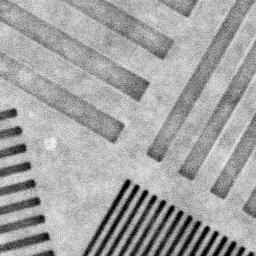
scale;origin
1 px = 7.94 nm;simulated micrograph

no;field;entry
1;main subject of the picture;groups of lines, slits or small figures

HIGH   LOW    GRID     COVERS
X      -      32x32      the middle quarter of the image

XXX------------XXXXXXXXXXXXXXXXX
XXXXX------------XXXXXXXXXXXXXXX
XXXXXX------------XXXXXXXXXXXXXX
XXXXXXXX------------XXXXXXXXXXX-
XXXXXXXXXX-----------XXXXXXXXXX-
XXXXXXXXXXX----------XXXXXXXXX--
-XXXXXXXXXXXX--------XXXXXXXXX--
---XXXXXXXXXXXX-----XXXXXXXXX---
----XXXXXXXXXXXX---XXXXXXXXX----
------XXXXXXXXXXXXXXXXXXXXXX----
--------XXXXXXXXXXXXXXXXXXX-----
----------XXXXXXXXXXXXXXXXX-----
-----------XXXXXXXXXXXXXXX-----X
X------------XXXXXXXXXXXX------X
XXX------------XXXXXXXXXX-----XX
XXXXX----------XXXXXXXXX------XX
XXXXXX---------XXXXXXXXX-----XXX
XXXXXXXX------XXXXXXXXX-----XXXX
XXXXXXXXXX----XXXXXXXX------XXXX
XXXXXXXXXXX--XXXXXXXXX-----XXXXX
XXXXXXXXXXXXXXXXXXXXX------XXXXX
XXXXXXXXXXXXXXXXXXXXX-----XXXXX-
XXXXXXXXXXXXXXXXXXXXX----XXXXXX-
XXXXXXXXXXXXXXXXXXXXXX---XXXXX--
XXXXXXXXXXXXXXXXXXXXXXX-XXXXXX--
XXXXXXXXXXXXXXXXXXXXXXXXXXXXX---
XXXXXXXXXXXXXXXXXXXXXXXXXXXXX---
XXXXXXXXXXXXXXXXXXXXXXXXXXXXX---
XXXXXXXXXXXXXXXXXXXXXXXXXXXXXX--
XXXXXXXXXXXXXXX--XXXXXXXXXXXXXXX
XXXXXXXXXXXXXXX-XX-XXXXXXXXXXXXX
XXXXXXXXXXXXXX--X--X-XXXXXXXXXXX